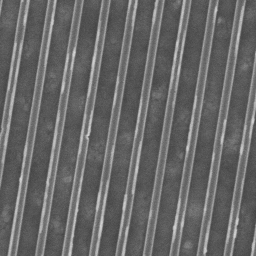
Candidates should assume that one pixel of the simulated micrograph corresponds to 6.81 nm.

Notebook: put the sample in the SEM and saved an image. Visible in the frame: parallel lines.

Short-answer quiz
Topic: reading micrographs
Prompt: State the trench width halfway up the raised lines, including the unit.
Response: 128 nanometres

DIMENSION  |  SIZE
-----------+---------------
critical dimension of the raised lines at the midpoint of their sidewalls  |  52.2 nanometres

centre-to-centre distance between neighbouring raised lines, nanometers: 182